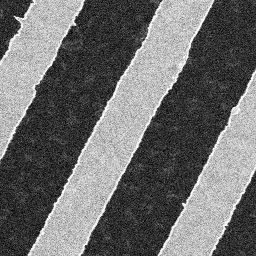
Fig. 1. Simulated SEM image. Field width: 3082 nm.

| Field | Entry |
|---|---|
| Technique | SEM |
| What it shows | one or a few lines or trenches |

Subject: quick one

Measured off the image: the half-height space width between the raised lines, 840 nanometers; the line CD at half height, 540 nm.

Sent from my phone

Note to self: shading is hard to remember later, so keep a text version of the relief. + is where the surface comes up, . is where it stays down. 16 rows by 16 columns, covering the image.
..+++.....+++...
.++++....++++...
.+++.....+++....
+++.....++++....
+++.....+++.....
++.....++++....+
++.....+++.....+
+.....+++.....++
+.....+++.....++
.....+++.....+++
.....+++.....+++
....+++.....+++.
....+++.....+++.
...+++.....+++..
...+++.....+++..
..+++.....+++...